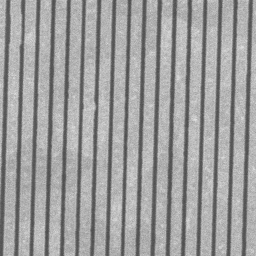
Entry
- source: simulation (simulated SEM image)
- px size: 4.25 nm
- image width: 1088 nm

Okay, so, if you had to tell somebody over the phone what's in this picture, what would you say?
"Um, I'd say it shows parallel lines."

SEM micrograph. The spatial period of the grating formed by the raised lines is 64.4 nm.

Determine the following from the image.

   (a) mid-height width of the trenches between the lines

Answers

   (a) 20.2 nanometres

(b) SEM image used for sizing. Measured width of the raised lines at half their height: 44 nm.